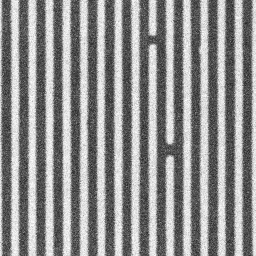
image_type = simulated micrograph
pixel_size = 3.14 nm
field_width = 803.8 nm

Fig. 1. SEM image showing parallel lines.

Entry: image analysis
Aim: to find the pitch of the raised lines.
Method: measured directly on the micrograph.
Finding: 0.0541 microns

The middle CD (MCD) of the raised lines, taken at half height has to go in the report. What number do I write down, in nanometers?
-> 21.6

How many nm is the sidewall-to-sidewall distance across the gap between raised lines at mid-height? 31